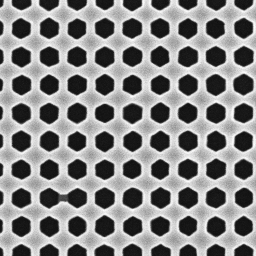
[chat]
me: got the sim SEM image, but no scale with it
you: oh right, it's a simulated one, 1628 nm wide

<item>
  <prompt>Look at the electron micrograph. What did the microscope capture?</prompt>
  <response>a regular array of holes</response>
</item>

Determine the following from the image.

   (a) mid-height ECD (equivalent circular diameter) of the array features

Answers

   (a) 20.2 px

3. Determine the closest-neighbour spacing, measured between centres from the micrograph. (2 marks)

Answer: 175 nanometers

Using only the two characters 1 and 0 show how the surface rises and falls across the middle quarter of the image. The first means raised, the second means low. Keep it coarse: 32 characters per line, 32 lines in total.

11101111100111110011111001111100
11111111111111111111111111111111
11111111111111111111111111111111
10000111000011100001111000111000
10000011000001000000110000011000
10000011000001000001110000011000
10000011000001100001110000111000
11001111100111110011111001111100
11111111111111111111111111111111
11111111111111111111111111111111
10000111100011100001110000111000
10000011000001100000110000011000
10000011000001100000110000111000
10000011000001100001110000111000
11001111100111110011111001111100
11111111111111111111111111111111
11111111111111111111111111111111
11000111100011110001111001111000
10000011000001100000110000011000
10000011000001100000100000010000
10000111000011100001110000111000
11101111100111110011111001111100
11111111111111111111111111111111
11111111111111111111111111111111
11000111100011110011111001111000
10000011000001100000110000110000
10000011000001100000110000110000
10000011000001100001110000111000
11000111100011110011111001111100
11111111111111111111111111111111
11111111111111111111111111111111
11000111100011100001111000111000